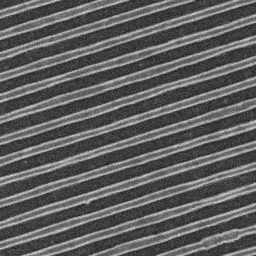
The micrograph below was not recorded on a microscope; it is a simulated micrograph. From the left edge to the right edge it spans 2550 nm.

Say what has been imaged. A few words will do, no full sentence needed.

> parallel lines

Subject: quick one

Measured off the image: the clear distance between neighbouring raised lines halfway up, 139 nanometres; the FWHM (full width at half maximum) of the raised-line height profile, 0.0594 micrometres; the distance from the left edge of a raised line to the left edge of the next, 200 nanometers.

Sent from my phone